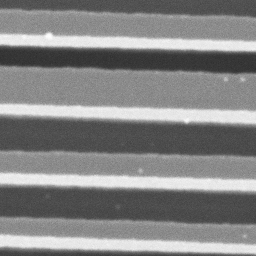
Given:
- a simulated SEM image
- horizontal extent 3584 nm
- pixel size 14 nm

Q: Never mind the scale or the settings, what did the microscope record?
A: lines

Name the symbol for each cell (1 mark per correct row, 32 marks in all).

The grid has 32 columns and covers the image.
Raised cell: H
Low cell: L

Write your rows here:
LLLLLLLLLLLLLLLLLLLLLLLLLLLLLLLL
HHHHHHHLHHLLLLLLLLLLLLLLLLLLLLLL
HHHHHHHHHHHHHHHHHHHHHHHHHHHHHHHH
HHHHHHHHHHHHHHHHHHHHHHHHHHHHHHHH
HHHHHHHHHHHHHHHHHHHHHHHHHHHHHHHH
HHHHHHHHHHHHHHHHHHHHHHHHHHHHHHHH
LLLLLLLLLLLLLLLLLLLLLLLLLLLLLLLL
LLLLLLLLLLLLLLLLLLLLLLLLLLLLLLLL
HHHHHLLLHLLLLLLLLLLLLLLLLLLLLLLL
HHHHHHHHHHHHHHHHHHHHHHHHHHHHHHHH
HHHHHHHHHHHHHHHHHHHHHHHHHHHHHHHH
HHHHHHHHHHHHHHHHHHHHHHHHHHHHHHHH
HHHHHHHHHHHHHHHHHHHHHHHHHHHHHHHH
HHHHHHHHHHHHHHHHHHHHHHHHHHHHHHHH
LLLLLLLLHHHHHHHHHHHHHHHHHHHHHHHH
LLLLLLLLLLLLLLLLLLLLLLLLLLLLLLLL
LLLLLLLLLLLLLLLLLLLLLLLLLLLLLLLL
LLLLLLLLLLLLLLLLLLLLLLLLLLLLLLLL
LLLLLLLLLLLLLLLLLLLLLLLLLLLLLLLL
HHHHHHHHHHHHHHHHHHHHHHHHLLLLLLLL
HHHHHHHHHHHHHHHHHHHHHHHHHHHHHHHH
HHHHHHHHHHHHHHHHHHHHHHHHHHHHHHHH
HHHHHHHHHHHHHHHHHHHHHHHHHHHHHHHH
LLLLLLLLLLLLLLLLLLLLHHHHHHHHHHHH
LLLLLLLLLLLLLLLLLLLLLLLLLLLLLLLL
LLLLLLLLLLLLLLLLLLLLLLLLLLLLLLLL
LLLLLLLLLLLLLLLLLLLLLLLLLLLLLLLL
HHHHHHHHHLLLLLLLLLLLLLLLLLLLLLLL
HHHHHHHHHHHHHHHHHHHHHHHHHHHHHHHH
HHHHHHHHHHHHHHHHHHHHHHHHHHHHHHHH
HHHHHHHHHHHHHHHHHHHHHHHHHHHHHHHH
LLLLLLLLLLLLLLLLLLLLLLHHHHHHHHHH